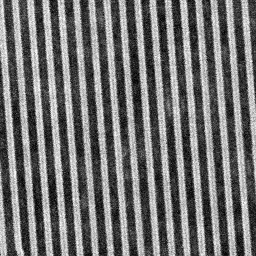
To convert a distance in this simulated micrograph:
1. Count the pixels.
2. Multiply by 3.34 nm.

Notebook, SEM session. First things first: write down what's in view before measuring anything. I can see parallel lines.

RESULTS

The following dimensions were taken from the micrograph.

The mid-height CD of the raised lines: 0.017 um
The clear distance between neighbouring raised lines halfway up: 33.7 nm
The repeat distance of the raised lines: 50.9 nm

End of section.